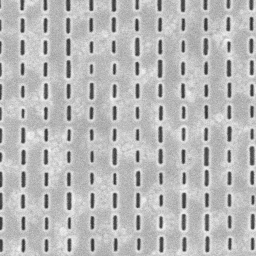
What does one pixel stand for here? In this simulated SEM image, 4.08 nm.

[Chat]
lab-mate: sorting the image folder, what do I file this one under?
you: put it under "a regular array of holes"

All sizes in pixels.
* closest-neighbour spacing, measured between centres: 21.9